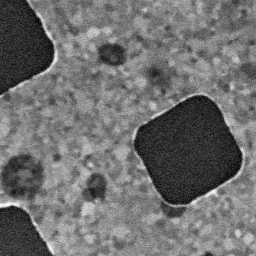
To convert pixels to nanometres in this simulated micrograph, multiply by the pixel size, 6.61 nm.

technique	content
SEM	holes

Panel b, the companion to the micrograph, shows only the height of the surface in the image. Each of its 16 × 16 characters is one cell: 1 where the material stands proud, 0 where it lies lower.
0011111111111111
0001111111111111
0001111111111111
0001111111111111
0001111111111111
0111111111111111
1111111111100011
1111111110000011
1111111100000001
1111111100000001
1111111110000001
1111111110000011
1111111111001111
0011111111111111
0011111111111111
0001111111111111